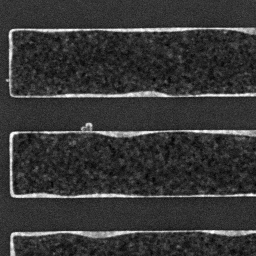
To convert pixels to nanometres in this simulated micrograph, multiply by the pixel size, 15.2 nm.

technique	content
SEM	wiring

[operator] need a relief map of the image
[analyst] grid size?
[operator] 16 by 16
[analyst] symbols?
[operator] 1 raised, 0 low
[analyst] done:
0000000000000000
0000000000000000
0111111111111111
0111111111111111
0111111111111111
0111111111111111
0000000000000000
0000000000000000
0111111111111111
0111111111111111
0111111111111111
0111111111111111
0000000000000000
0000000000000000
0001100011111101
0111111111111111